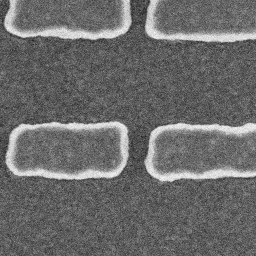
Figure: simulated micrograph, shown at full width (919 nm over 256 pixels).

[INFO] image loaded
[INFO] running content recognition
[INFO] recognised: raised bodies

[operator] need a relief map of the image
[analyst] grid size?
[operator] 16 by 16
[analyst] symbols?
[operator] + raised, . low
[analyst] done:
.+++++++.+++++++
.+++++++.+++++++
................
................
................
................
................
................
.+++++++..++++++
.+++++++.+++++++
.+++++++.+++++++
................
................
................
................
................